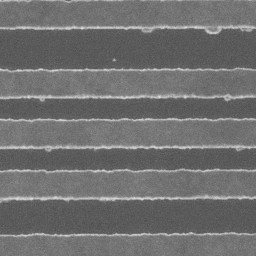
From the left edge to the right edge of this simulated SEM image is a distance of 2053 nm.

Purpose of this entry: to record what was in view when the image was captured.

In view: lines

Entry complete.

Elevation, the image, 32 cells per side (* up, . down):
********************************
********************************
********************************
********************.*******.*.*
................................
................................
................................
................................
................................
********************************
********************************
********************************
................................
................................
................................
********************************
********************************
********************************
...**...........*...*.**........
................................
................................
********************************
********************************
********************************
********************************
................................
................................
................................
................................
********************************
********************************
********************************